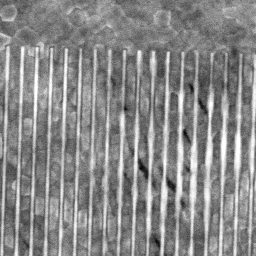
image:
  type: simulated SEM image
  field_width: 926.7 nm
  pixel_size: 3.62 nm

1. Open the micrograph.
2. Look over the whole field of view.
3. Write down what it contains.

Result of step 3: parallel lines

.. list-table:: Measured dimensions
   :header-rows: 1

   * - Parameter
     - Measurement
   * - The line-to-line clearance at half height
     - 42.5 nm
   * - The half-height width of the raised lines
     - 0.0095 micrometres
